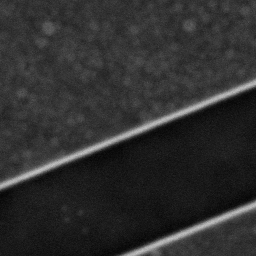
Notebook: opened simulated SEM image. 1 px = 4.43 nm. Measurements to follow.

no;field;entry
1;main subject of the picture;one or a few lines or trenches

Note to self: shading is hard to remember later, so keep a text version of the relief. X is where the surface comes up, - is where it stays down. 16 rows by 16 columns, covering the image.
XXXXXXXXXXXXXXXX
XXXXXXXXXXXXXXXX
XXXXXXXXXXXXXXXX
XXXXXXXXXXXXXXXX
XXXXXXXXXXXXXXXX
XXXXXXXXXXXXXXX-
XXXXXXXXXXXXX---
XXXXXXXXXX------
XXXXXXXX--------
XXXXX-----------
XXX-------------
----------------
----------------
--------------XX
------------XXXX
---------XXXXXXX